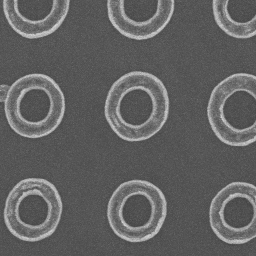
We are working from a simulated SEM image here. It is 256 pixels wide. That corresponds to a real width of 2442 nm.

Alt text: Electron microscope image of ring-shaped raised bodies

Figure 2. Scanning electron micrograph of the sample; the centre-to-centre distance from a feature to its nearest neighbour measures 0.985 um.